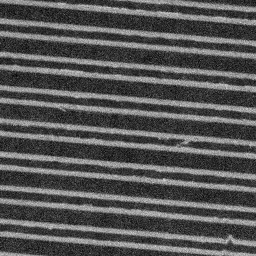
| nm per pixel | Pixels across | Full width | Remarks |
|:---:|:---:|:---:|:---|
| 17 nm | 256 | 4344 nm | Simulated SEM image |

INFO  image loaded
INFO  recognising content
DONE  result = parallel lines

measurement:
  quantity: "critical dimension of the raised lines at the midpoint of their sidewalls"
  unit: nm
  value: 228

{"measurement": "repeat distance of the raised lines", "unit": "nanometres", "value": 564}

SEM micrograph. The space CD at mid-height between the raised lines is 342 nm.